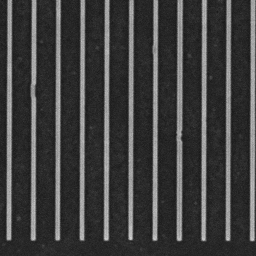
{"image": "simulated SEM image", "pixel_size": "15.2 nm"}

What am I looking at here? parallel lines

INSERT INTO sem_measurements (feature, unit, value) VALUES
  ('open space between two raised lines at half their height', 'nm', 330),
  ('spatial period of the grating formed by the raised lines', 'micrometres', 0.371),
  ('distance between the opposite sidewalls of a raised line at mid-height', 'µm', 0.0419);